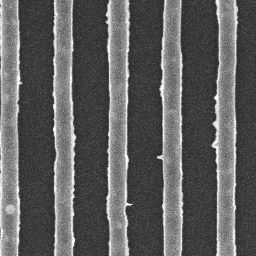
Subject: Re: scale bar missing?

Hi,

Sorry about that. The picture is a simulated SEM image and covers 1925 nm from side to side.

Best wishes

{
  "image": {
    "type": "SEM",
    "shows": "parallel lines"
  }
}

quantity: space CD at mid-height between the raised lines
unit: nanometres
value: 264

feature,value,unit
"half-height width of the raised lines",142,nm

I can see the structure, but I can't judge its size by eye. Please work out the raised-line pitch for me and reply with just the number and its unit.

407 nm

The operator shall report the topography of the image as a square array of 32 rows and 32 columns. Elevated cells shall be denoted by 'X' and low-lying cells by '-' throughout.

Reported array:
XX-----XX----XXX-----XX----XXX--
XX-----XX----XXX----XXX----XXX--
XX-----XX----XXX----XXX----XXX--
XX-----XX----XXX----XX-----XXX--
XX-----XX----XXX----XX-----XXX--
XX-----XX----XXX----XX-----XX---
XX-----XX----XXX----XXX----XX---
XX-----XX-----XX----XXX----XX---
XX-----XX-----XX----XXX----XX---
XXX----XX-----XX----XXX----XX---
XXX----XX-----XX----XXX----XX---
XX-----XX-----XX----XXX----XX---
XX-----XX-----XX----XXX----XX---
XX-----XX-----XX----XXX----XX---
XX-----XX-----XX----XXX----XX---
XX-----XX-----XX----XXX----XX---
XX-----XX-----XX----XXX----XXX--
XX-----XX-----XX----XXX----XX---
XX-----XX-----XX----XXX----XX---
XX-----XX----XXX----XXX----XX---
XX-----XX-----XX----XXX----XX---
XX-----XX----XXX----XXX----XX---
XX-----XX-----XX-----XX----XX---
XX-----XX-----XX----XXX----XX---
XX-----XX----XXX----XXX----XX---
XX-----XX----XXX----XXX----XX---
XXX----XX----XXX----XXX----XX---
XXX----XX-----XX----XXX----XX---
XX-----XX-----XX----XXX----XX---
XX-----XX-----XX-----XX----XX---
XX-----XX-----XX-----XX----XX---
XX-----XX-----XX-----XX----XXX--